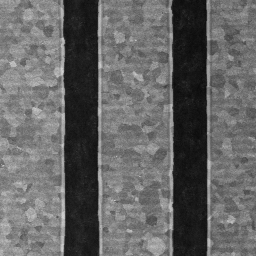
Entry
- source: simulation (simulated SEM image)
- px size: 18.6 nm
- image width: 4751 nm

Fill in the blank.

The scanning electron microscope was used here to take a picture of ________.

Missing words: one or a few lines or trenches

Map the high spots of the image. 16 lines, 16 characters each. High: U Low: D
UUUUDDUUUUUDDUUU
UUUUDDUUUUUDDUUU
UUUUDDUUUUUDDUUU
UUUUDDUUUUUDDUUU
UUUUDDUUUUUDDUUU
UUUUDDUUUUUDDUUU
UUUUDDUUUUUDDUUU
UUUUDDUUUUUDDUUU
UUUUDDUUUUUDDUUU
UUUUDDUUUUUDDUUU
UUUUDDUUUUUDDUUU
UUUUDDUUUUUDDUUU
UUUUDDUUUUUDDUUU
UUUUDDUUUUUDDUUU
UUUUDDUUUUUDDUUU
UUUUDDUUUUUDDUUU